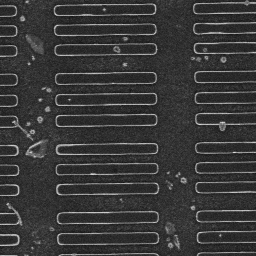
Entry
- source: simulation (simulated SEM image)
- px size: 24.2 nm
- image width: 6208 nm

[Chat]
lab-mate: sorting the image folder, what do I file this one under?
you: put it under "groups of lines, slits or small figures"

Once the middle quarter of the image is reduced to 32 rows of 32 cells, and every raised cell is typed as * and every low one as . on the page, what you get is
................................
................................
...........************.........
***********************.........
***********************.........
................................
................................
............***********.........
***********************.........
***********************.........
................................
................................
................................
***********************.........
***********************.........
................................
................................
................................
................................
................................
***********************.........
***********************.........
***************.................
................................
................................
***********************.........
***********************.........
****************................
................................
................................
************************........
************************........